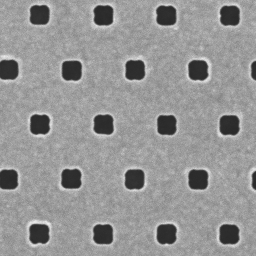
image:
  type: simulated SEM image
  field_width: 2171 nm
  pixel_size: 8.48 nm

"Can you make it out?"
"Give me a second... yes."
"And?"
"a regular array of holes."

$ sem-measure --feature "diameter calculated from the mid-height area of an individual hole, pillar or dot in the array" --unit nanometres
182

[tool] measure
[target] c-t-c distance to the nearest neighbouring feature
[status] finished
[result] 532 nm